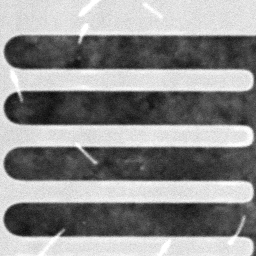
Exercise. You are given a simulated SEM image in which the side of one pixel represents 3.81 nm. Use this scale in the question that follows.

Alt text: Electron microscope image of groups of lines, slits or small figures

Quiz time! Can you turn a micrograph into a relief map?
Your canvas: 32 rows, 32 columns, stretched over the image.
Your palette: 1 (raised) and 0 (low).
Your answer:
11111111111111111111111111111111
11111111111111111111111111111111
11111111111111111111111111111111
11111111111111111111111111111111
11000000000000000000000000000000
10000000000000000000000000000000
00000000000000000000000000000000
10000000000000000000000000000000
11000000000000000000000000000000
11111111111111111111111111111110
11111111111111111111111111111111
11000000000000000000000000000000
10000000000000000000000000000000
00000000000000000000000000000000
10000000000000000000000000000000
11000000000000000000000000000000
11111111111111111111111111111111
11111111111111111111111111111111
11000000000000000000000000000000
10000000000000000000000000000000
00000000000000000000000000000000
10000000000000000000000000000000
11000000000000000000000000000000
11111111111111111111111111111111
11111111111111111111111111111110
11000000000000000000000000000000
10000000000000000000000000000000
00000000000000000000000000000000
10000000000000000000000000000000
11000000000000000000000000000000
11111111111111111111111111111111
11111111111111111111111111111110